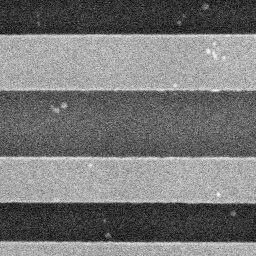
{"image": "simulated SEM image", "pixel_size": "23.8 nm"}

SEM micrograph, lines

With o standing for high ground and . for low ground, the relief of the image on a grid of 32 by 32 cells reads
................................
................................
................................
................................
.....o....ooooooooo.oooooooooooo
oooooooooooooooooooooooooooooooo
oooooooooooooooooooooooooooooooo
oooooooooooooooooooooooooooooooo
oooooooooooooooooooooooooooooooo
oooooooooooooooooooooooooooooooo
oooooooooooooooooooooooooooooooo
................................
................................
................................
................................
................................
................................
................................
................................
................................
oooooooooooooooooooooooooooooooo
oooooooooooooooooooooooooooooooo
oooooooooooooooooooooooooooooooo
oooooooooooooooooooooooooooooooo
oooooooooooooooooooooooooooooooo
................................
................................
................................
................................
................................
oooooooooooooooooooooooooooooooo
oooooooooooooooooooooooooooooooo